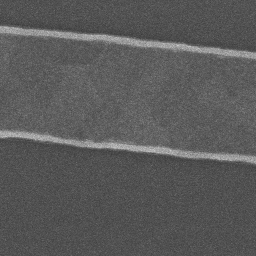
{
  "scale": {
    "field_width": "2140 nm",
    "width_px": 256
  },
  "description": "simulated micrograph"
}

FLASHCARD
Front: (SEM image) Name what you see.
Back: one or a few lines or trenches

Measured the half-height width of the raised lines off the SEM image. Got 881 nanometres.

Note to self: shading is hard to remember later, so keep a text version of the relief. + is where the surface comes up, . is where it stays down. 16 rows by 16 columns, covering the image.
................
................
++++++++........
++++++++++++++++
++++++++++++++++
++++++++++++++++
++++++++++++++++
++++++++++++++++
..++++++++++++++
...........+++++
................
................
................
................
................
................